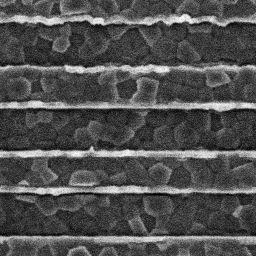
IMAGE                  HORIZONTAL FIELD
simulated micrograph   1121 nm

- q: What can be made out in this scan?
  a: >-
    one or a few lines or trenches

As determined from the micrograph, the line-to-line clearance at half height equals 194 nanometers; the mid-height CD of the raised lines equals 178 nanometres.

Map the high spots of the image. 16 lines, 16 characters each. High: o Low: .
oooooooooooooooo
................
................
................
oooooooooooooooo
oooooooooooooooo
oooooooooooooooo
................
................
.oooooooooooo.oo
oooooooooooooooo
oooooooooooooooo
................
................
................
oooooooooooooooo